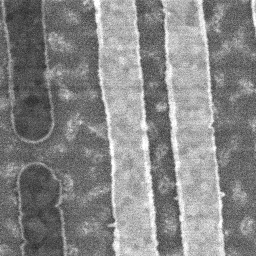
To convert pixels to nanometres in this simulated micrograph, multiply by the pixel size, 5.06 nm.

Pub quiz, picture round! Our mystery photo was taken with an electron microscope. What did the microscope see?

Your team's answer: one or a few lines or trenches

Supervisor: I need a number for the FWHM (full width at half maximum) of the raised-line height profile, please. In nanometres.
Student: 204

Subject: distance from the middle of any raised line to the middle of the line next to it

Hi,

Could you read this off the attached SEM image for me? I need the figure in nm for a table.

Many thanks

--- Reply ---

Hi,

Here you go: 397